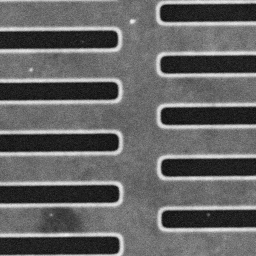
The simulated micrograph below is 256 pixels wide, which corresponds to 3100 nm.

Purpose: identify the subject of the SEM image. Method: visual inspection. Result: groups of lines, slits or small figures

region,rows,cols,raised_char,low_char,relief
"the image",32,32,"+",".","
++++++++++++++++++++............
++++++++++++++++++++............
++++++++++++++++++++............
++++++++++++++++++++++++++++++++
...............+++++++++++++++++
...............+++++++++++++++++
++++++++++++++++++++++++++++++++
++++++++++++++++++++............
++++++++++++++++++++............
++++++++++++++++++++++++++++++++
...............+++++++++++++++++
...............+++++++++++++++++
..............++++++++++++++++++
++++++++++++++++++++............
++++++++++++++++++++............
++++++++++++++++++++............
+++++++++.....++++++++++++++++++
...............+++++++++++++++++
...............+++++++++++++++++
++++++++++++++++++++++++++++++++
++++++++++++++++++++............
++++++++++++++++++++............
++++++++++++++++++++++++++++++++
...............+++++++++++++++++
...............+++++++++++++++++
..............++++++++++++++++++
++++++++++++++++++++............
++++++++++++++++++++............
++++++++++++++++++++............
...............+++++++++++++++++
...............+++++++++++++++++
...............+++++++++++++++++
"